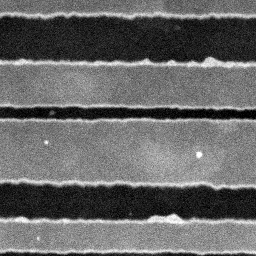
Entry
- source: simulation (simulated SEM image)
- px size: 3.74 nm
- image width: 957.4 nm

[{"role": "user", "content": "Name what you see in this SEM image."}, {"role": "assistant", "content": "lines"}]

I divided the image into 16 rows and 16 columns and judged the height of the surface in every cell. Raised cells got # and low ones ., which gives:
################
................
................
................
################
################
################
################
################
################
################
........####.###
................
................
################
################